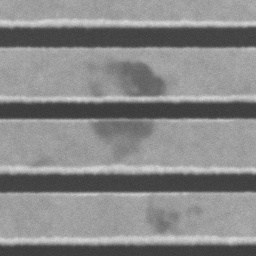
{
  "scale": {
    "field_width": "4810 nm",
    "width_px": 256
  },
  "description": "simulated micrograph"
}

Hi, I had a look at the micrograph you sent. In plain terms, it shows lines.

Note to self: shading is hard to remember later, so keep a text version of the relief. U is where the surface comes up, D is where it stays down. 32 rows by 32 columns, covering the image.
UUUUUUUUUUUUUUUUUUUUUUUUUUUUUUUU
UUUUUUUUUUUUUUUUUUUUUUUUUUUUUUUU
UUUUUUUUUUUUUUUUUUUUUUUUUUUUUUUU
DDDDDDDDDDDDDDDDDDDDDDDDDDDDDDDD
DDDDDDDDDDDDDDDDDDDDDDDDDDDDDDDD
DDDDDDDDDDDDDDDDDDDDDDDDDDDDDDDD
UUUUUUUUUUUUUUUUUUUUUUUUUUUUUUUU
UUUUUUUUUUUUUUUUUUUUUUUUUUUUUUUU
UUUUUUUUUUUUUUUUUUUUUUUUUUUUUUUU
UUUUUUUUUUUUUUUUUUUUUUUUUUUUUUUU
UUUUUUUUUUUUUUUUUUUUUUUUUUUUUUUU
UUUUUUUUUUUUUUUUUUUUUUUUUUUUUUUU
UUUUUUUUUUUUUUUUUUUUUUUUUUUUUUUU
DDDDDDDDDDDDDDDDDDDDDDDDDDDDDDDD
DDDDDDDDDDDDDDDDDDDDDDDDDDDDDDDD
UUUUUUUUUUUUUUUUUUUUUUUUUUUUUUUU
UUUUUUUUUUUUUUUUUUUUUUUUUUUUUUUU
UUUUUUUUUUUUUUUUUUUUUUUUUUUUUUUU
UUUUUUUUUUUUUUUUUUUUUUUUUUUUUUUU
UUUUUUUUUUUUUUUUUUUUUUUUUUUUUUUU
UUUUUUUUUUUUUUUUUUUUUUUUUUUUUUUU
UUUUUUUUUUUUUUUUUUUUUUUUUUUUUUUU
DDDDDDDDDDDDDDDDDDDDDDDDDDDDDDDD
DDDDDDDDDDDDDDDDDDDDDDDDDDDDDDDD
UUUUUUUUUUUUUUUUUUUUUUUUUUUUUUUU
UUUUUUUUUUUUUUUUUUUUUUUUUUUUUUUU
UUUUUUUUUUUUUUUUUUUUUUUUUUUUUUUU
UUUUUUUUUUUUUUUUUUUUUUUUUUUUUUUU
UUUUUUUUUUUUUUUUUUUUUUUUUUUUUUUU
UUUUUUUUUUUUUUUUUUUUUUUUUUUUUUUU
DDDDDDDDDDDDDDDDDDDDDDDDDDDDDDDD
DDDDDDDDDDDDDDDDDDDDDDDDDDDDDDDD